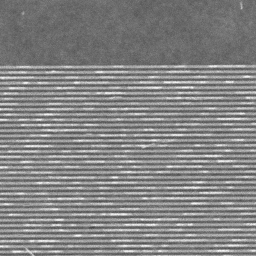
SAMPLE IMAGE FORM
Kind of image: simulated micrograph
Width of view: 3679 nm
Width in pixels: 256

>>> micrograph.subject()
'parallel lines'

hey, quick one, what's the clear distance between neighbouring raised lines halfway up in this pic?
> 50.3 nanometers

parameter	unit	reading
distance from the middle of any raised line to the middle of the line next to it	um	0.0758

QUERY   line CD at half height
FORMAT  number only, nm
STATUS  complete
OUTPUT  25.1